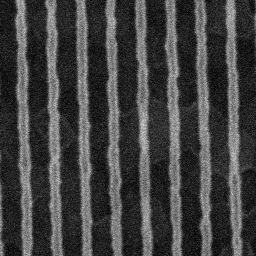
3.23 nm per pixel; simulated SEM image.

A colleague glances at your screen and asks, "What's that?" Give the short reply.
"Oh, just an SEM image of parallel lines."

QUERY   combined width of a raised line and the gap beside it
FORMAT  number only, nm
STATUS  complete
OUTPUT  96.8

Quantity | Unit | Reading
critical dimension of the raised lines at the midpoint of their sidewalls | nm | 27.4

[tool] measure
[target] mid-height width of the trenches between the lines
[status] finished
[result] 69 nm